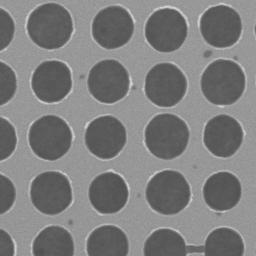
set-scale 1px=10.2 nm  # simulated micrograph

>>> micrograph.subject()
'a regular array of holes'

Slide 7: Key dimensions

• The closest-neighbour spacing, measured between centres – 54.2 px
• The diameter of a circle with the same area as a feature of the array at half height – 0.428 micrometres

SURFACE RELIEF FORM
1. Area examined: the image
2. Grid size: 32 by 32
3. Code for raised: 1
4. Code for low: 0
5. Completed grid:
11111101111111111111111111111111
01110000111110001110001111000111
00110000011100000110000110000011
00100000011100000100000110000011
00110000011100001100000110000011
01111000111100011110000111000111
11111111111111111111111111111111
11111111111110111111111111111111
01111000111100011110001111000011
00110000011000001100000110000001
00110000011000001100000110000001
00110000011000001100000110000011
01111001111100011110000111000011
11111111111111111111111111111111
11111101111110111111001111100111
01110000111000011110000111000011
00110000011000001100000011000011
00110000011000001100000011000011
00110000011000011110000111000011
01111000111100111110001111100111
11111111111111111111111111111111
11111101111111111111001111111111
01110000111100011110000111000011
00110000011000001100000010000011
00110000011000001100000010000011
00110000011100001110000111000011
11111000111110111111001111111111
11111111111111111111111111111111
11111100111100011111111111111111
01111000011000001110001111000011
00110000011000001100000110000011
00110000011000001100000000000011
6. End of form